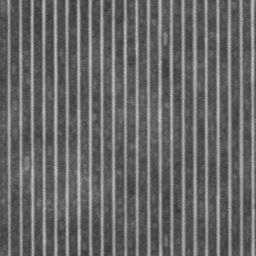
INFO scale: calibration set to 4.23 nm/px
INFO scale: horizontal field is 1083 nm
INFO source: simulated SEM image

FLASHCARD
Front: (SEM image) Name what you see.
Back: parallel lines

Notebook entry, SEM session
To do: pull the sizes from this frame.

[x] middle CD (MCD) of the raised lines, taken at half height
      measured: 7.4 nm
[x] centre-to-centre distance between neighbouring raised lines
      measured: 49 nanometers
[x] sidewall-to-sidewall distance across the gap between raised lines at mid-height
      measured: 39.1 nm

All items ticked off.